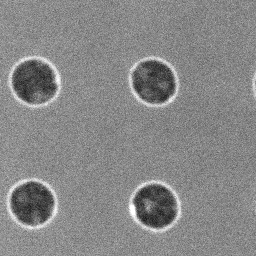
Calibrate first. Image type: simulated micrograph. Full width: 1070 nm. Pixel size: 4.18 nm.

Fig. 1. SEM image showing raised bodies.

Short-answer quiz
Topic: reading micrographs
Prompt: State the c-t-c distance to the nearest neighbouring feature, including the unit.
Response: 504 nanometres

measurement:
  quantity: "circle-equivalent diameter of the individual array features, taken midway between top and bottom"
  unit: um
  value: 0.205